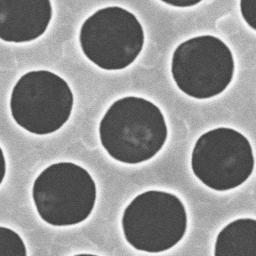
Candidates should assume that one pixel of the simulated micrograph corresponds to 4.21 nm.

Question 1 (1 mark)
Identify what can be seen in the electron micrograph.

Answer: holes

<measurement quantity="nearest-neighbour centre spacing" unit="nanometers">395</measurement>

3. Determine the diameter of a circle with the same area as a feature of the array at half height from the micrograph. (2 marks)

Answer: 0.27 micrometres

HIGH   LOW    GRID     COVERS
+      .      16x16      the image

...+++..+++++++.
...++....++++++.
..+++....+++..++
+++++....++....+
++.++++++++....+
+...+++++++...++
+....++...++++++
+...++....++++++
++++++....+++..+
+++++++...++....
+++..+++++++....
++....+++++++..+
++....++...+++++
+++...++....++++
.+++++++....++..
..++++++...++...